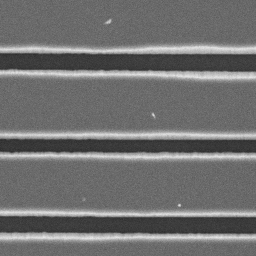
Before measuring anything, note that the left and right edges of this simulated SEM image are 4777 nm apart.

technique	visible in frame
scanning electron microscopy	lines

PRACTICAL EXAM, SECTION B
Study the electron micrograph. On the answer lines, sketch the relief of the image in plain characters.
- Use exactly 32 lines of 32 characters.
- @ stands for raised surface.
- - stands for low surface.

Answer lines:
@@@@@@@@@@@@@@@@@@@@@@@@@@@@@@@@
@@@@@@@@@@@@@@@@@@@@@@@@@@@@@@@@
@@@@@@@@@@@@@@@@@@@@@@@@@@@@@@@@
@@@@@@@@@@@@@@@@@@@@@@@@@@@@@@@@
@@@@@@@@@@@@@@@@@@@@@@@@@@@@@@@@
@@@@@@@@@@@@@@@@@@@@@@@@@@@@@@@@
--------------------------------
--------------------------------
--------------------------------
@@@@@@@@@@@@@@@@@@@@@@@@@@@@@@@@
@@@@@@@@@@@@@@@@@@@@@@@@@@@@@@@@
@@@@@@@@@@@@@@@@@@@@@@@@@@@@@@@@
@@@@@@@@@@@@@@@@@@@@@@@@@@@@@@@@
@@@@@@@@@@@@@@@@@@@@@@@@@@@@@@@@
@@@@@@@@@@@@@@@@@@@@@@@@@@@@@@@@
@@@@@@@@@@@@@@@@@@@@@@@@@@@@@@@@
@@@@@@@@@@@@@@@@@@@@@@@@@@@@@@@@
--------------------------------
--------------------------------
@@@@@@@@@@@@@@@@@@@@@@@@@@@@@@@@
@@@@@@@@@@@@@@@@@@@@@@@@@@@@@@@@
@@@@@@@@@@@@@@@@@@@@@@@@@@@@@@@@
@@@@@@@@@@@@@@@@@@@@@@@@@@@@@@@@
@@@@@@@@@@@@@@@@@@@@@@@@@@@@@@@@
@@@@@@@@@@@@@@@@@@@@@@@@@@@@@@@@
@@@@@@@@@@@@@@@@@@@@@@@@@@@@@@@@
@@@@@@@@@@@@@@@@@@@@@@@@@@@@@@@@
--------------------------------
--------------------------------
@@@@@@-@-@-------@@-----@-------
@@@@@@@@@@@@@@@@@@@@@@@@@@@@@@@@
@@@@@@@@@@@@@@@@@@@@@@@@@@@@@@@@